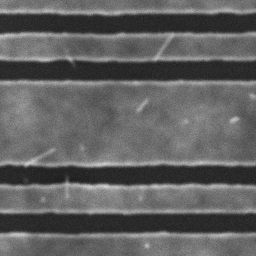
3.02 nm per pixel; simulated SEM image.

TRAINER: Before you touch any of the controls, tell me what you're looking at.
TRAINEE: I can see lines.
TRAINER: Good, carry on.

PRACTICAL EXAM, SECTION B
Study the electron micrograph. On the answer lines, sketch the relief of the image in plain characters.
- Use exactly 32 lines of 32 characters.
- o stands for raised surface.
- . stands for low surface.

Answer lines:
oooooooooooooooooooooooooooooooo
oooooooooooooooooooooooooooo.ooo
................................
................................
oooooooooooooooooooooooooooooooo
oooooooooooooooooooooooooooooooo
oooooooooooooooooooooooooooooooo
....ooo....oooooooo.............
................................
................................
oooooooooooooooooooooooooooooooo
oooooooooooooooooooooooooooooooo
oooooooooooooooooooooooooooooooo
oooooooooooooooooooooooooooooooo
oooooooooooooooooooooooooooooooo
oooooooooooooooooooooooooooooooo
oooooooooooooooooooooooooooooooo
oooooooooooooooooooooooooooooooo
oooooooooooooooooooooooooooooooo
oooooooooooooooooooooooooooooooo
oooooooooooooooooooooooooooooooo
................................
................................
oooooooooooooooooooooooooooooooo
oooooooooooooooooooooooooooooooo
oooooooooooooooooooooooooooooooo
oooooo.ooooooooooooooooooooooooo
................................
................................
oooooooooooooooooooooooooooooooo
oooooooooooooooooooooooooooooooo
oooooooooooooooooooooooooooooooo